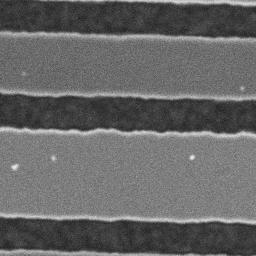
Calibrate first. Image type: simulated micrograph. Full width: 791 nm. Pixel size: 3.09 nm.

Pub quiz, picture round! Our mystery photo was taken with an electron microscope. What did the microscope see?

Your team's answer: lines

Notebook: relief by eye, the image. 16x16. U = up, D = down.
DDDDDDDDDDDDDDDD
DDDDDDDDDDDDDDDD
UUUUUUUUUUUUUUUU
UUUUUUUUUUUUUUUU
UUUUUUUUUUUUUUUU
UUUUUUUUUUUUUUUU
DDDDDDDDDDDDDDDD
DDDDDDDDDDDDDDDD
UUUUUUUUUUUUUUUU
UUUUUUUUUUUUUUUU
UUUUUUUUUUUUUUUU
UUUUUUUUUUUUUUUU
UUUUUUUUUUUUUUUU
UUUUUUUUUUUUUUUU
DDDDDDDDDDDDDDDD
DDDDDDDDDDDDDDDD